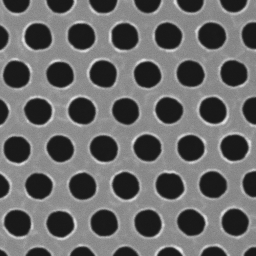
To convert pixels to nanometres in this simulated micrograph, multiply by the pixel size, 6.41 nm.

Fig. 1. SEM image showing a regular array of holes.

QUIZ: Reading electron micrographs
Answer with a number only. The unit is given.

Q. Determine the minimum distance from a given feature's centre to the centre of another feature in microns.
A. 0.273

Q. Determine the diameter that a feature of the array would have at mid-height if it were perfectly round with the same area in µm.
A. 0.174